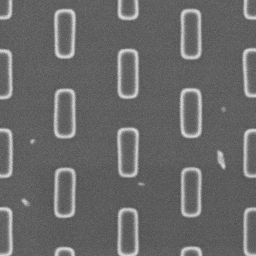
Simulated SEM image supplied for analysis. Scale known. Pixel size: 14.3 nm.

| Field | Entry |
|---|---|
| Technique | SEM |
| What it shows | groups of lines, slits or small figures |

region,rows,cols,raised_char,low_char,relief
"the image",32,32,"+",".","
+..............++..............+
+......++......++......++......+
.......++..............++.......
.......++..............++.......
.......++..............++.......
.......++..............++.......
+......++......++......++......+
+..............++..............+
+..............++..............+
+..............++..............+
+..............++..............+
+......++......++......++......+
.......++..............++.......
.......++..............++.......
.......++..............++.......
.......++..............++.......
+......++......++......++......+
+..............++..............+
+..............++..............+
+..............++..............+
+..............++..............+
+......++......++......++......+
.......++..............++.......
.......++..............++.......
.......++..............++.......
.......++..............++.......
+......++......++......++......+
+..............++..............+
+..............++..............+
+..............++..............+
+..............++..............+
+......++......++......++......+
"